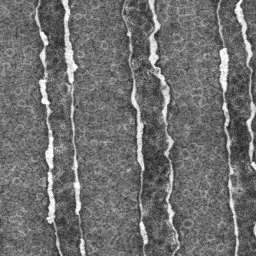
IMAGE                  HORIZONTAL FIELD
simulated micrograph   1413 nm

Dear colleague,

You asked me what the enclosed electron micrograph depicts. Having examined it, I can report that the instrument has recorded one or a few lines or trenches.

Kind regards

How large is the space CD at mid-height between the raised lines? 328 nm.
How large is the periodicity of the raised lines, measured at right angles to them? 0.494 micrometres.